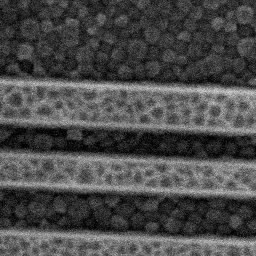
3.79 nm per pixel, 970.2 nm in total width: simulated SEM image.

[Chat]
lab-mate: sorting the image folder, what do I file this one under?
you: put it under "one or a few lines or trenches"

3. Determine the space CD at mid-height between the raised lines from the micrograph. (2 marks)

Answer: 159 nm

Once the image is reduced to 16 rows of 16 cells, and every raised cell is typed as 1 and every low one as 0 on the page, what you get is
0000000000000000
0000000000000000
0000000000000000
0000000000000000
0000000000000000
1111111110000000
1111111111111111
1111111111111111
0000000000000000
0000000000000000
1111111111111111
0111111111111111
0000000000000000
0000000000000000
0000000000000000
1111111111111111